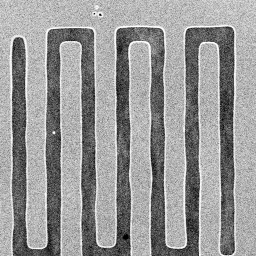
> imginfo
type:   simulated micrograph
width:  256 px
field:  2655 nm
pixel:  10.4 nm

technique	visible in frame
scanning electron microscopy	groups of lines, slits or small figures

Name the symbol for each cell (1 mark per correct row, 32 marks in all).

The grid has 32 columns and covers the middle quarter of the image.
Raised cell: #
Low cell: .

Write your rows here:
####....#####....#####...#####..
####....#####....#####...#####..
####....#####....#####...#####..
####....#####....#####...#####..
####....#####....#####...#####..
####....#####....#####...#####..
####....#####....####....#####..
####....#####....####....#####..
####....#####....####....#####..
####....#####....####....#####..
####....#####....####....#####..
####....#####....####....#####..
####....#####....#####...#####..
####....#####....#####...#####..
####....#####....#####...#####..
####....#####....#####...#####..
####....#####....####....#####..
####....#####....####....#####..
####....#####....####....#####..
####....#####....####....#####..
####....#####....####....#####..
####....#####....####....#####..
####....#####....####....#####..
####....#####....####....#####..
####....#####....#####...#####..
####....#####....#####...#####..
####....#####....#####...#####..
####....#####....#####...#####..
####....#####....#####...#####..
####....#####....#####...#####..
####....#####....#####...#####..
####....#####....#####...#####..